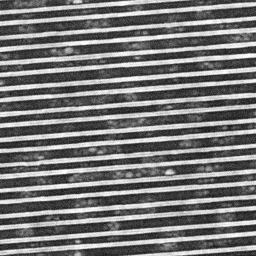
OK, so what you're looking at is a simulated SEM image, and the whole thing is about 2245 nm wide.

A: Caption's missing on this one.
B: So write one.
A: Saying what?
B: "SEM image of parallel lines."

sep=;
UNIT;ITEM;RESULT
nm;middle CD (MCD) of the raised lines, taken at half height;21.8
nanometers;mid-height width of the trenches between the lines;80.9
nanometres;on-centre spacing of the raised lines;111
